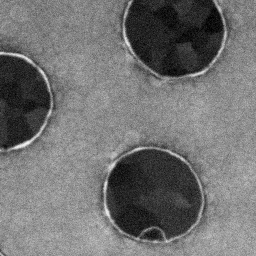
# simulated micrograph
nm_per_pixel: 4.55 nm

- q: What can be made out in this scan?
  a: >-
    raised bodies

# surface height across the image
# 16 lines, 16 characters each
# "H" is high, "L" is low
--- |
LLLLLLLLHHHHHHLL
LLLLLLLLHHHHHHLL
LLLLLLLLHHHHHHLL
HLLLLLLLHHHHHHLL
HHHLLLLLLHHHHLLL
HHHLLLLLLLLLLLLL
HHHLLLLLLLLLLLLL
HHHLLLLLLLLLLLLL
HHLLLLLLLLLLLLLL
LLLLLLLLHHHLLLLL
LLLLLLLHHHHHLLLL
LLLLLLLHHHHHHLLL
LLLLLLLHHHHHHLLL
LLLLLLLHHHHHHLLL
LLLLLLLLHHHHLLLL
LLLLLLLLLLLLLLLL